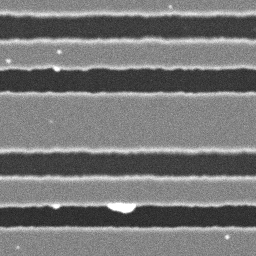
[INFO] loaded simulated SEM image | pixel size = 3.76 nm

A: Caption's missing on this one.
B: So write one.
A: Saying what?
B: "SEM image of lines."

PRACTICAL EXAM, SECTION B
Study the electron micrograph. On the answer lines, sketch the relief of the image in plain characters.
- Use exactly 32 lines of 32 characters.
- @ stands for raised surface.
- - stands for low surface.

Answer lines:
@@@@@@@@@@@@@@@@@@@@@@@@@@@@@@@@
@@@@@@@@@@@@@@@@@@@@@@@@@@@@@@@@
--------------------------------
--------------------------------
--------------------------------
@@@@@@@@@@@@@@@@@@@@@@@@@@@@@@@@
@@@@@@@@@@@@@@@@@@@@@@@@@@@@@@@@
@@@@@@@@@@@@@@@@@@@@@@@@@@@@@@@@
@@@@@@@@@@@@-@@@@@@@@@@@@@@@@@-@
--------------------------------
--------------------------------
--------------------------------
@@@@@@@@@@@@@@@@@@@@@@@@@@@@@@@@
@@@@@@@@@@@@@@@@@@@@@@@@@@@@@@@@
@@@@@@@@@@@@@@@@@@@@@@@@@@@@@@@@
@@@@@@@@@@@@@@@@@@@@@@@@@@@@@@@@
@@@@@@@@@@@@@@@@@@@@@@@@@@@@@@@@
@@@@@@@@@@@@@@@@@@@@@@@@@@@@@@@@
@@@@@@@@@@@@@@@@@@@@@@@@@@@@@@@@
--------------------------------
--------------------------------
--------------------------------
@@@@@@@@@@@@@@@@@@@@@@@@@@@@@@@@
@@@@@@@@@@@@@@@@@@@@@@@@@@@@@@@@
@@@@@@@@@@@@@@@@@@@@@@@@@@@@@@@@
@@@@@@@@@@@@@@@@@@@@@@@@@@@@@@@@
---------------@----------------
--------------------------------
@@@@@@@@@@@@@@@@@@-@@-@@@@@@@@@@
@@@@@@@@@@@@@@@@@@@@@@@@@@@@@@@@
@@@@@@@@@@@@@@@@@@@@@@@@@@@@@@@@
@@@@@@@@@@@@@@@@@@@@@@@@@@@@@@@@